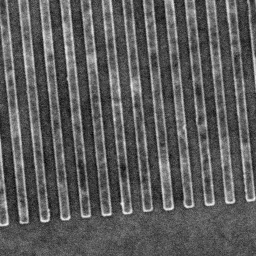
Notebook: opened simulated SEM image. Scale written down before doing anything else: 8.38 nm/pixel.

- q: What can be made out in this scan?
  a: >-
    parallel lines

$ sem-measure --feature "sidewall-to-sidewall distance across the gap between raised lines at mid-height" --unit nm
97.9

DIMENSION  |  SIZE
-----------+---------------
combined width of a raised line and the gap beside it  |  173 nm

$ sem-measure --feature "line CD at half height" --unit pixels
8.95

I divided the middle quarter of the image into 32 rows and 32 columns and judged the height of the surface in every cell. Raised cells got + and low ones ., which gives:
.++...++...++...+++..+++...++...
.++...++...++....++...++...++...
.++...++....+....++...++...++...
.++...++....+....++...++...++...
.++...++....++...++...++...++...
.++...+++...++...++...++...++...
.++....++...++...++...++...++...
.+++...++...++...++...++....++..
..++...++...++...++...+++...++..
..++...++...++...++....++...++..
..++...++...++...+++...++...++..
..++...++...++....++...++...++..
..++...++...++....++...++...++..
..++...++....+....++...++...++..
..++...+++...++...++...++...++..
..++...+++...++...++...++...++..
..++...+++...++...++...++...++..
..++....++...++...++...++....++.
...++...++...++...++...+++...++.
...++...++...++...++...+++...++.
...++...++...++...+++..+++...++.
...++...++...++....++...++...++.
...++...++...+++...++...++...++.
...++...++....++...++...++...++.
...++...+++...++...++...++...++.
...++...+++...++...++...++...++.
...++...+++...++...++...++...++.
...++....++...++...++...++...+++
....++...++...++...++...++....++
+...++...++...++...++...+++...++
+...++...++...++...+++..+++...++
+...++...++...++....++..+++...++